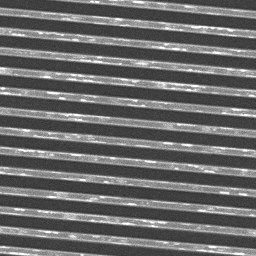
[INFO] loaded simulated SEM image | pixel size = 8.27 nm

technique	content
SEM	parallel lines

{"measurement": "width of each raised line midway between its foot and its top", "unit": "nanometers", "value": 66.8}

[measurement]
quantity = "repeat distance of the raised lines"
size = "164 nm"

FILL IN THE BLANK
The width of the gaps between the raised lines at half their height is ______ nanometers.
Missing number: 96.7